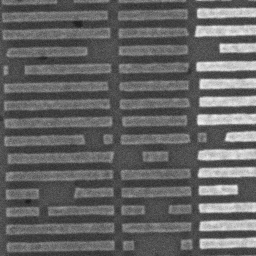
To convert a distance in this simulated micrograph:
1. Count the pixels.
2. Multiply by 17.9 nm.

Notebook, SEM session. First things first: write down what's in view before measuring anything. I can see wiring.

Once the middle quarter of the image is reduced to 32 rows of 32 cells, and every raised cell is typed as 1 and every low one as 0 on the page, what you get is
11111111111100111111111111111110
11111111111100111111111111111110
00000000000000000000000000000000
00000000000000000000000000000000
00000000000000000000011111111110
11111111111000111111111111111110
11111111100000011100000000000000
00000000000000000000000000000000
00000000000000000000000000000000
11111111111000111111111111111110
11111111111000111111111111111110
00000000000000000000000000000000
00000000000000000000000000000000
00111111111100011111111111111110
11111111111100011111111111111110
00000000000000000000000000000000
00000000000000000000000000000000
00000000000000000000000000000000
11111000001100111111111111111110
11111000001100111111111111111100
00000000000000000000000000000000
00000000000000000000000000000000
11111111111100000000111111000000
11111111111100000000111111000000
11111110000100000000000000000000
00000000000000000000000000000000
00000000000000000000011111111110
11111111111100111111111111111110
11111111111100011111111111111100
00000000000000000000000000000000
00000000000000000000000000000000
00011111111100011111111111111111